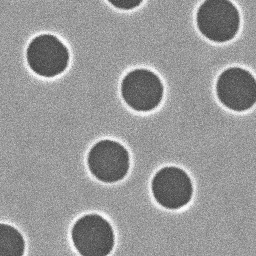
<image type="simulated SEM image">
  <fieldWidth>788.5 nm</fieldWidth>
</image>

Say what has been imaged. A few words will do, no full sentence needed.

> holes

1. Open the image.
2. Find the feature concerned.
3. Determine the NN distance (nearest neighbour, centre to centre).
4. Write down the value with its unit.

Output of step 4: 227 nanometers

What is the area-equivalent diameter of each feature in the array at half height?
0.134 um